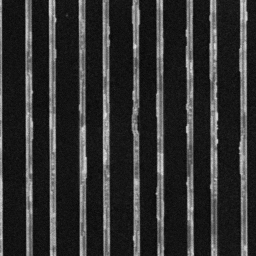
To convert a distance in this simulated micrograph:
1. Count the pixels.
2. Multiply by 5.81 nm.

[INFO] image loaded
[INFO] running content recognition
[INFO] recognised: parallel lines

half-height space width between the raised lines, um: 0.137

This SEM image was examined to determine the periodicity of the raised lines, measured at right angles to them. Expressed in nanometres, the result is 156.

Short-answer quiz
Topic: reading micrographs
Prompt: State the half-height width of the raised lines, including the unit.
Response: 30.5 nm